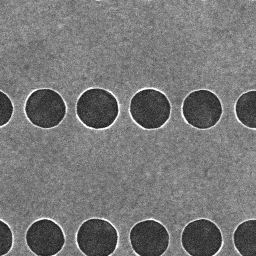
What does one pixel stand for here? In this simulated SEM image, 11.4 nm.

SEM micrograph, holes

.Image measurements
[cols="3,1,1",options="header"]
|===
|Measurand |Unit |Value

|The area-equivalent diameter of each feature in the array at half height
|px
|40.3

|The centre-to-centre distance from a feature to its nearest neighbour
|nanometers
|592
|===